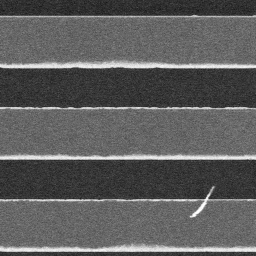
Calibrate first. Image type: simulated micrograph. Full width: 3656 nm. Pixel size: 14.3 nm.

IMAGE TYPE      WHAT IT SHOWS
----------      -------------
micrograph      lines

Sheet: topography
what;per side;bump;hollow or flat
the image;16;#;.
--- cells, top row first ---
................
################
################
################
................
................
................
################
################
################
................
................
............#...
################
################
################